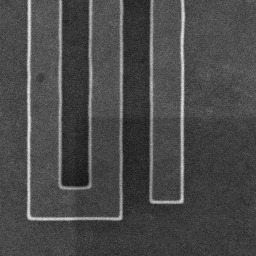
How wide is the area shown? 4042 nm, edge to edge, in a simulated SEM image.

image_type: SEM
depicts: groups of lines, slits or small figures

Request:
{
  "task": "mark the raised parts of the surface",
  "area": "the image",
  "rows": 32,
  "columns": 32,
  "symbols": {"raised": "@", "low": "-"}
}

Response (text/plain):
----@@@@---@@@@----@@@@---------
----@@@@---@@@@----@@@@---------
----@@@@---@@@@----@@@@---------
----@@@@---@@@@----@@@@---------
----@@@@---@@@@----@@@@---------
----@@@@---@@@@----@@@@---------
----@@@@---@@@@----@@@@---------
----@@@@---@@@@----@@@@---------
----@@@@---@@@@----@@@@---------
----@@@@---@@@@----@@@@---------
----@@@@---@@@@----@@@@---------
----@@@@---@@@@----@@@@---------
----@@@@---@@@@----@@@@---------
----@@@@---@@@@----@@@@---------
----@@@@---@@@@----@@@@---------
----@@@@---@@@@----@@@@---------
----@@@@---@@@@----@@@@---------
----@@@@---@@@@----@@@@---------
----@@@@---@@@@----@@@@---------
----@@@@---@@@@----@@@@---------
----@@@@---@@@@----@@@@---------
----@@@@---@@@@----@@@@---------
----@@@@---@@@@----@@@@---------
----@@@@---@@@@----@@@@---------
----@@@@@@@@@@@----@@@@---------
----@@@@@@@@@@@-----------------
----@@@@@@@@@@@-----------------
--------------------------------
--------------------------------
--------------------------------
--------------------------------
--------------------------------